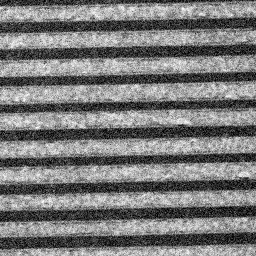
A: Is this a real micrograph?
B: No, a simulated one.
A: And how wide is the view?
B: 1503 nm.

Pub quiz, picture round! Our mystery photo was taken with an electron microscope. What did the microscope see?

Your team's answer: parallel lines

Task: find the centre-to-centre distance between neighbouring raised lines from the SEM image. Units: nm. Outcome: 158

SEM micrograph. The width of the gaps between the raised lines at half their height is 85.1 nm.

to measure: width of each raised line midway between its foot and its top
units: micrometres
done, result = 0.0741